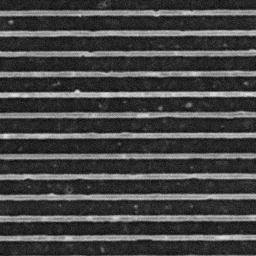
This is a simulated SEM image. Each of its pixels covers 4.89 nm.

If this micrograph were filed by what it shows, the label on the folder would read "parallel lines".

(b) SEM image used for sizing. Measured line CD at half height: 22 nm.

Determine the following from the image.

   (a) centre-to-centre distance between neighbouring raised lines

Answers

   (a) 100 nanometres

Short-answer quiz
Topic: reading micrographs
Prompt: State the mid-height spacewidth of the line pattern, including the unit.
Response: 78.9 nm